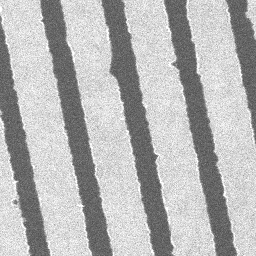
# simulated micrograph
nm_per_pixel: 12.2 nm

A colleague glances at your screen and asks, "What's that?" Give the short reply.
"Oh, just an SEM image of one or a few lines or trenches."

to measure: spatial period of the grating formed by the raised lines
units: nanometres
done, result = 742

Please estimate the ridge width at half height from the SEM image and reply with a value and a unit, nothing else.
282 nm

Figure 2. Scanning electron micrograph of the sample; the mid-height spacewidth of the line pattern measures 457 nanometers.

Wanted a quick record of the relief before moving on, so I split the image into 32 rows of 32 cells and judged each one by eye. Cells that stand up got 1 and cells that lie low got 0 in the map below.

00000111000001110000111000001110
00000111000001110000011000001110
00000111000001110000011100000110
00000111000001110000011100000111
10000011000001111000011100000111
10000011100000111000011100000111
10000011100000111000001110000111
10000011100000111000001110000011
11000001100000111000001110000011
11000001110000111000001110000011
11000001110000011100000110000011
11000001110000011100000111000001
11000001110000011100000111000001
11100000110000011100000111000001
11100000111000011100000111000001
11100000111000001110000011000001
11100000111000001110000011100000
01100000111000001110000011100000
01110000011000001110000011100000
01110000011100000111000011100000
01110000011100000111000001100000
01110000011100000111000001110000
00110000011100000111000001110000
00111000001110000111000001110000
00111000001110000011000001110000
00111000001110000011100000110000
00111000001110000011100000111000
00011100001110000011100000111000
00011100000111000011100000111000
00011100000111000001100000011000
00011100000111000001110000011000
00011100000111000001110000011100